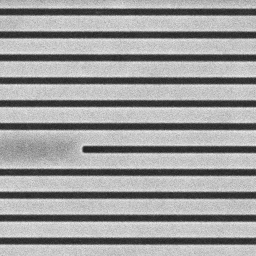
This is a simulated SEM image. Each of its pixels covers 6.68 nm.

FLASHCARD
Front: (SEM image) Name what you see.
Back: groups of lines, slits or small figures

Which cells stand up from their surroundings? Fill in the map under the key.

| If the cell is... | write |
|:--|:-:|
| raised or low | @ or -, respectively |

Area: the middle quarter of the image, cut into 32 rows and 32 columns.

@@@@@@@@@@@@@@@@@@@@@@@@@@@@@@@@
@@@@@@@@@@@@@@@@@@@@@@@@@@@@@@@@
@@@@@@@@@@@@@@@@@@@@@@@@@@@@@@@@
--------------------------------
--------------------------------
@@@@@@@@@@@@@@@@@@@@@@@@@@@@@@@@
@@@@@@@@@@@@@@@@@@@@@@@@@@@@@@@@
@@@@@@@@@@@@@@@@@@@@@@@@@@@@@@@@
@@@@@@@@@@@@@@@@@@@@@@@@@@@@@@@@
--------------------------------
--------------------------------
@@@@@@@@@@@@@@@@@@@@@@@@@@@@@@@@
@@@@@@@@@@@@@@@@@@@@@@@@@@@@@@@@
@@@@@@@@@@@@@@@@@@@@@@@@@@@@@@@@
@@@@@@@@@@@@@@@@@@@@@@@@@@@@@@@@
--------------------------------
--------------------------------
@@@@@@@@@@@@@@@@@@@@@@@@@@@@@@@@
@@@@@@@@@@@@@@@@@@@@@@@@@@@@@@@@
@@@@@@@@@@@@@@@@@@@@@@@@@@@@@@@@
@@@@@---------------------------
@@@@----------------------------
@@@@@@@@@@@@@@@@@@@@@@@@@@@@@@@@
@@@@@@@@@@@@@@@@@@@@@@@@@@@@@@@@
@@@@@@@@@@@@@@@@@@@@@@@@@@@@@@@@
@@@@@@@@@@@@@@@@@@@@@@@@@@@@@@@@
--------------------------------
--------------------------------
@@@@@@@@@@@@@@@@@@@@@@@@@@@@@@@@
@@@@@@@@@@@@@@@@@@@@@@@@@@@@@@@@
@@@@@@@@@@@@@@@@@@@@@@@@@@@@@@@@
@@@@@@@@@@@@@@@@@@@@@@@@@@@@@@@@